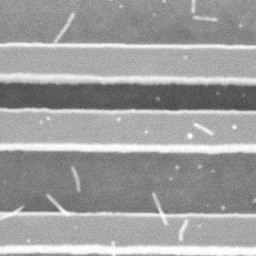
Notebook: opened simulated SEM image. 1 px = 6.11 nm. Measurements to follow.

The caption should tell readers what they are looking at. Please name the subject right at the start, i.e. lines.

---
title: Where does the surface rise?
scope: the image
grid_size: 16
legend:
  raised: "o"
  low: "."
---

................
................
................
oooooooooooooooo
oooooooooooooooo
................
................
oooooooooooooooo
oooooooooooooooo
................
................
................
................
oooooooooooooooo
oooooooooooooooo
oooooooooooooooo